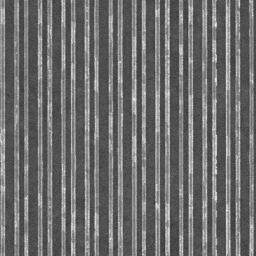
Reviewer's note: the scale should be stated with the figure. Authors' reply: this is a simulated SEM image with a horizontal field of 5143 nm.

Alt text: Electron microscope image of parallel lines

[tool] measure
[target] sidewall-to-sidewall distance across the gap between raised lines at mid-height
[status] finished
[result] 198 nanometres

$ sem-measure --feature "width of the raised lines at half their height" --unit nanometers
67.8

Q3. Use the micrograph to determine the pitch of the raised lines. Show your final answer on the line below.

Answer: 238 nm